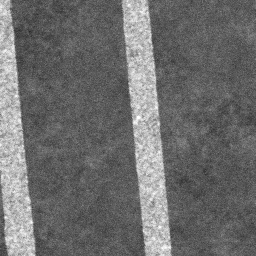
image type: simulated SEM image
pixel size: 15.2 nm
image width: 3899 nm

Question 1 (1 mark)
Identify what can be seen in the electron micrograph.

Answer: one or a few lines or trenches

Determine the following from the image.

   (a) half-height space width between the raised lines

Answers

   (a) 1690 nanometers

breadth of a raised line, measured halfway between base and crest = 396 nm